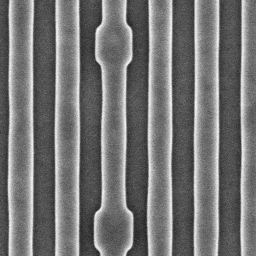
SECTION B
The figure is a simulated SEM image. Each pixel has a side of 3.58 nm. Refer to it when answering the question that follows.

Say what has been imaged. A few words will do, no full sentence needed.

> wiring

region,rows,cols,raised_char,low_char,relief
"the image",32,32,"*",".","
.***...***...***...***..***...**
.***...***...***...***..***...**
.***...***...***...**...***...**
.***...***..****...**...***...**
.***...***..****...**...***...**
.***...***..****...**...***...**
.***...***..****...**...***...**
.***...***..****...**...***...**
.***...***...***...**...***...**
.***...***...***...**...***...**
.***...***...***...**...***...**
.***...***...***...**...***...**
.***...***...***...**...***...**
.***...***...***...**...***...**
.***...***...***...**...***...**
.***...***...***...***..***...**
.***...***...***...***..***...**
.***...***...***...***..***...**
.***...***...***...**...***...**
.***...***...***...**...***...**
.***...***...***...**...***...**
.***...***...***...**...***...**
.***...***...***...**...***...**
.***...***...***...**...***...**
.***...***...***..***...***...**
.***...***...***..***...***...**
.***...***..****..****..***...**
.***...***..*****.****..***...**
.***...***..*****.****..***...**
.***...***..*****.****..***...**
.***...***..****...**...***...**
.***...***..****...**...***...**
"